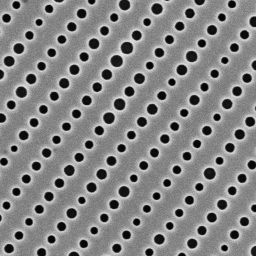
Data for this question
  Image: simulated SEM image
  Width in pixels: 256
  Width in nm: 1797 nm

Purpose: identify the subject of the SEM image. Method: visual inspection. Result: a regular array of holes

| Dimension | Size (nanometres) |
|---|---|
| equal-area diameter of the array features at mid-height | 63.9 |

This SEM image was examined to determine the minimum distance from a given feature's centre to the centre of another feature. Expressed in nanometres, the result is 114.